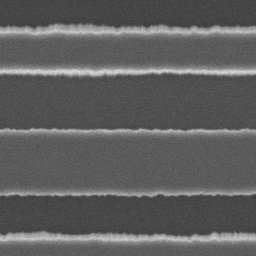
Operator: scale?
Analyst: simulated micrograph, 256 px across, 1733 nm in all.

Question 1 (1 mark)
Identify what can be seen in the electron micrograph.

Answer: lines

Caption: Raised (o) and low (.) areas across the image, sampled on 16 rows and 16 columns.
................
................
oooooooooooooooo
oooooooooooooooo
..ooooooo...oooo
................
................
................
oooooooooooooooo
oooooooooooooooo
oooooooooooooooo
oooooooooooooooo
................
................
................
oooooooooooooooo